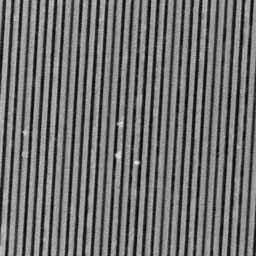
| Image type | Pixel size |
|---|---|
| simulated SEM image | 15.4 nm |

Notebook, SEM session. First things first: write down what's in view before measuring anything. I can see parallel lines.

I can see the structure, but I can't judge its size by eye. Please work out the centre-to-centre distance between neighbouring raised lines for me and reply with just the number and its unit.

132 nanometres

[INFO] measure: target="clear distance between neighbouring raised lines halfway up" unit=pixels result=3.5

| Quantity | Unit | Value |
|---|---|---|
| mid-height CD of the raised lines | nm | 80.9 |